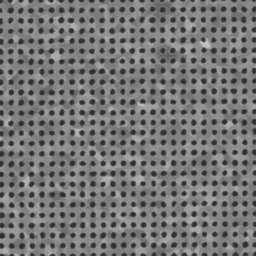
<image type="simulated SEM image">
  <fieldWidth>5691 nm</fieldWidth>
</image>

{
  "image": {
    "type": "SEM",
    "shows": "a regular array of holes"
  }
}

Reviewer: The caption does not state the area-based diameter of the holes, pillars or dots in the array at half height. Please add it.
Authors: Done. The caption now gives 128 nm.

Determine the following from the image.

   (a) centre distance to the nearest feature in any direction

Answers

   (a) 9.81 px